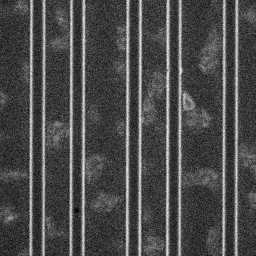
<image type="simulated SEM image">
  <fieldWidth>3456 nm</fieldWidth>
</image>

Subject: parallel lines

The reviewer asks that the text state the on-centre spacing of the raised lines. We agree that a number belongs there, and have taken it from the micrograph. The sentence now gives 651 nm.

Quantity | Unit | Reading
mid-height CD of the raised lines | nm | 184